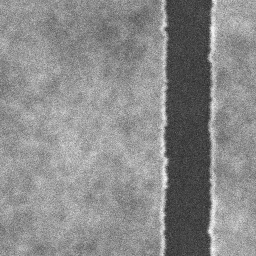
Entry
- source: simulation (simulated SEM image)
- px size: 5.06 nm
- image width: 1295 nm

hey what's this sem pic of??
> one or a few lines or trenches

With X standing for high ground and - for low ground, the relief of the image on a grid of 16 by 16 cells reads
XXXXXXXXXX---XXX
XXXXXXXXXX---XXX
XXXXXXXXXX---XXX
XXXXXXXXXX---XXX
XXXXXXXXXX---XXX
XXXXXXXXXX---XXX
XXXXXXXXXX---XXX
XXXXXXXXXX---XXX
XXXXXXXXXX---XXX
XXXXXXXXXX---XXX
XXXXXXXXXX---XXX
XXXXXXXXXX---XXX
XXXXXXXXXX---XXX
XXXXXXXXXX---XXX
XXXXXXXXXX---XXX
XXXXXXXXXX---XXX